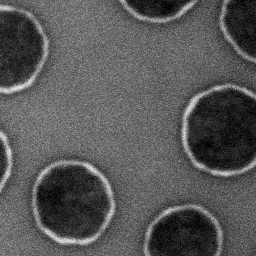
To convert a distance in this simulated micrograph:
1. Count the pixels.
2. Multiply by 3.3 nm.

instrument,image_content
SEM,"raised bodies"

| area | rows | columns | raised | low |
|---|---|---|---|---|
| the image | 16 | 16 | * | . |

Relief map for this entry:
*.......****..**
**............**
***...........**
***............*
**..............
*.............*.
............****
............****
............****
*...........****
*..***.......***
..*****.........
..*****.........
..*****...***...
...***...*****..
.........*****..